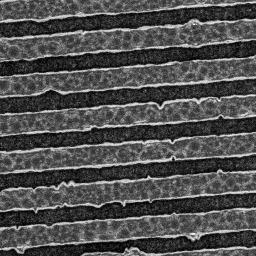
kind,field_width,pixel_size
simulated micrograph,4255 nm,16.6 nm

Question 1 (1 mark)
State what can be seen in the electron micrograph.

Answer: parallel lines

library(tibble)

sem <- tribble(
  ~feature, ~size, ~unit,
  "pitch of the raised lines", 0.628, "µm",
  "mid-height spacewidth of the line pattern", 265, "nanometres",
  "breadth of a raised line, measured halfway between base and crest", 0.352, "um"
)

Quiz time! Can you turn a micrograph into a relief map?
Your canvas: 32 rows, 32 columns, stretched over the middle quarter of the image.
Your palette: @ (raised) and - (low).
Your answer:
------------------@@@@@@@@@@@@@@
------@@@@@@@@@@@@@@@@@@@@@@@@@@
@@@@@@@@@@@@@@@@@@@@@@@@@@@@@@@@
@@@@@@@@@@@@@@@@@@@@@@@@@@@@@@@@
@@@@@@@@@@@@@@@@@@@@@@@@@@@@@@@@
@@@@@@@@@@@@@@@@@@@@------------
@@@@@@@@@@----------------------
--------------------------------
--------------------------------
--------------------------@@@@@@
----------@@@@-@@@@@@@@@-@@@@@@@
@@@@@@@@@@@@@@@@@@@@@@@@@@@@@@@@
@@@@@@@@@@@@@@@@@@@@@@@@@@@@@@@@
@@@@@@@@@@@@@@@@@@@@@@@@@@@@@@@@
@@@@@@@@@@@@@@@@@@@@@@@@@@@@@---
@@@@@@@@@@@-@@------------------
@@@@@@--------------------------
--------------------------------
-------------------------------@
---------------------@@@@@@@@@@@
----@@@@@@@@@@@@@@@@@@@@@@@@@@@@
@@@@@@@@@@@@@@@@@@@@@@@@@@@@@@@@
@@@@@@@@@@@@@@@@@@@@@@@@@@@@@@@@
@@@@@@@@@@@@@@@@@@@@@@@@@@@-@@@@
@@@@@@@@@@@@@@@@@@@-------------
@@@@@@@@@-----------------------
--------------------------------
--------------------------------
---------------------@----@@@@@@
----------@-@@@@@@@@@@@@@@@@@@@@
@@@@@@@@@@@@@@@@@@@@@@@@@@@@@@@@
@@@@@@@@@@@@@@@@@@@@@@@@@@@@@@@@